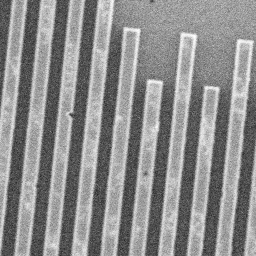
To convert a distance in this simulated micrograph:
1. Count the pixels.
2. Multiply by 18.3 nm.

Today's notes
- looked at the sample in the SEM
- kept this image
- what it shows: parallel lines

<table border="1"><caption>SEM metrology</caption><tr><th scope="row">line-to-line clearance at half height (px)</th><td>15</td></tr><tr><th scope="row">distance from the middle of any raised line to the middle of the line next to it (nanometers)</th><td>523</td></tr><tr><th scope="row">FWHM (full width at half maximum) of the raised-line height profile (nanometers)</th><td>257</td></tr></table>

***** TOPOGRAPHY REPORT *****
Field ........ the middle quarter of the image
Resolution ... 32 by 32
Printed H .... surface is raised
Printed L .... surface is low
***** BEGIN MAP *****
HHHLLLLHHHLLLLHHHHLLLLLLLLLLLHHH
HHHLLLLHHHLLLLHHHHLLLLLLLLLLLHHH
HHHLLLLHHHLLLLHHHHLLLLLLLLLLLHHH
HHHLLLLHHHLLLLHHHLLLLLLLLLLLHHHH
HHHLLLLHHHLLLLHHHLLLLHLLLLLLHHHL
HHHLLLLHHHLLLLHHHLLLLHHHLLLLHHHL
HHHLLLHHHHLLLLHHHLLLLHHHLLLLHHHL
HHLLLLHHHHLLLLHHHLLLLHHHLLLLHHHL
HHLLLLHHHHLLLLHHHLLLLHHHLLLLHHHL
HHLLLLHHHHLLLHHHHLLLLHHHLLLLHHHL
HHLLLLHHHLLLLHHHHLLLHHHHLLLLHHHL
HHLLLLHHHLLLLHHHHLLLHHHHLLLLHHHL
HLLLLLHHHLLLLHHHHLLLHHHHLLLLHHHL
HHLLLLHHHLLLLHHHLLLLHHHLLLLHHHHL
HHLLLLHHHLLLLHHHLLLLHHHHLLLHHHLL
HHLLLLHHHLLLLHHHLLLLHHHLLLLHHHLL
HLLLLHHHHLLLLHHHLLLLHHHLLLLHHHLL
HLLLLHHHHLLLLHHHLLLLHHHLLLLHHHLL
HLLLLHHHHLLLLHHHLLLLHHHLLLLHHHLL
HLLLLHHHLLLLHHHHLLLHHHHLLLLHHHLL
HLLLLHHHLLLLHHHHLLLHHHHLLLLHHHLL
HLLLLHHHLLLLHHHHLLLHHHHLLLLHHHLL
HLLLLHHHLLLLHHHLLLLHHHHLLLHHHHLL
HLLLLHHHLLLLHHHLLLLHHHLLLLHHHLLL
HLLLLHHHLLLLHHHLLLLHHHLLLLHHHLLL
HLLLHHHHLLLLHHHLLLLHHHLLLLHHHLLL
LLLLHHHHLLLLHHHLLLLHHHLLLLHHHLLL
LLLLHHHHLLLLHHHLLLLHHHLLLLHHHLLL
LLLLHHHHLLLHHHHLLLLHHHLLLLHHHLLL
LLLLHHHLLLLHHHHLLLHHHHLLLLHHHLLL
LLLLHHHLLLLHHHHLLLHHHHLLLLHHHLLL
LLLLHHHLLLLHHHHLLLHHHHLLLLHHHLLL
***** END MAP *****